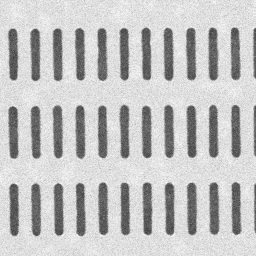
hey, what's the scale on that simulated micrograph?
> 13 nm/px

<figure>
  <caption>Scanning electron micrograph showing a regular array of holes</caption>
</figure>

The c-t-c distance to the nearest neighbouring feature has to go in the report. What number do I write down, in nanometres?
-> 286